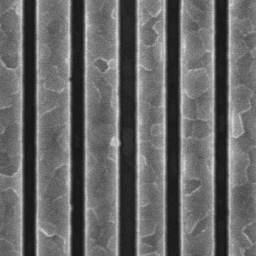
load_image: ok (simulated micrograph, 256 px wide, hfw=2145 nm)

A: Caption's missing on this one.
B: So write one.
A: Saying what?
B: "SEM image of parallel lines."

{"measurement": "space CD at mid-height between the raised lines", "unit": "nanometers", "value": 116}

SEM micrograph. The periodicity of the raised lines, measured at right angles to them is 403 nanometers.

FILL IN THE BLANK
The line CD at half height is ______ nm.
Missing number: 288